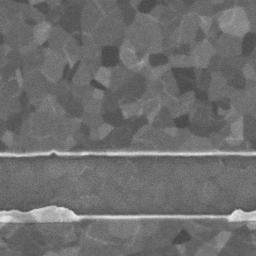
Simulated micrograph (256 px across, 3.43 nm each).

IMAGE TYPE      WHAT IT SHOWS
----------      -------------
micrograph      one or a few lines or trenches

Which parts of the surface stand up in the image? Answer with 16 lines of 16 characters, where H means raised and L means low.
HHHHHHHHHHHHHHHH
HHHHHHHHHHHHHHHH
HHHHHHHHHHHHHHHH
HHHHHHHHHHHHHHHH
HHHHHHHHHHHHHHHH
HHHHHHHHHHHHHHHH
HHHHHHHHHHHHHHHH
HHHHHHHHHHHHHHHH
HHHHHHHHHHHHHHHH
HHHHHHHHHHHHHHHH
LLLLLLLLLLLLLLLL
LLLLLLLLLLLLLLLL
LLLLLLLLLLLLLLLL
HHHHHLLLLLLLLLHH
HHHHHHHHHHHHHHHH
HHHHHHHHHHHHHHHH